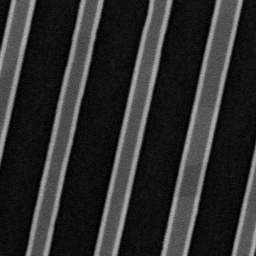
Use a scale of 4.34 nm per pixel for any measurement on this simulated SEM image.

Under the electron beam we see one or a few lines or trenches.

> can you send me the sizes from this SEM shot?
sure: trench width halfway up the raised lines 210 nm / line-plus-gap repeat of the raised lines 0.292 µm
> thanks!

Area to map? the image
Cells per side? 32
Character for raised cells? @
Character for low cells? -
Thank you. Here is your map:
--@@------@@@------@@------@@@--
-@@@------@@-------@@------@@@--
-@@@------@@-------@@------@@@--
-@@-------@@------@@@------@@---
-@@------@@@------@@------@@@---
-@@------@@-------@@------@@@---
@@@------@@-------@@------@@@---
@@@------@@------@@@------@@----
@@-------@@------@@-------@@----
@@------@@@------@@------@@@----
@@------@@-------@@------@@@----
@@------@@------@@@------@@@----
@-------@@------@@@------@@-----
@------@@@------@@------@@@-----
@------@@-------@@------@@@-----
@------@@-------@@------@@@-----
-------@@------@@@------@@------
-------@@------@@-------@@------
------@@@------@@------@@@------
------@@-------@@------@@@------
------@@-------@@------@@@------
------@@------@@@------@@-------
-----@@@------@@------@@@------@
-----@@-------@@------@@@------@
-----@@-------@@------@@@------@
-----@@------@@@------@@@------@
-----@@------@@@------@@------@@
----@@@------@@------@@@------@@
----@@-------@@------@@@------@@
----@@-------@@------@@@------@@
----@@------@@@------@@-------@@
----@@------@@-------@@------@@@